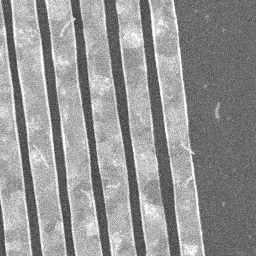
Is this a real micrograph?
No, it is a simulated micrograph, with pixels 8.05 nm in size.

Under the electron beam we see parallel lines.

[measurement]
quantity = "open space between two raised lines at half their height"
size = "0.0918 µm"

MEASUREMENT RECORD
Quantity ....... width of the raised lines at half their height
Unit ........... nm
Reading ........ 184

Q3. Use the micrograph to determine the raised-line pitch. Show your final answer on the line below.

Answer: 34.4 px